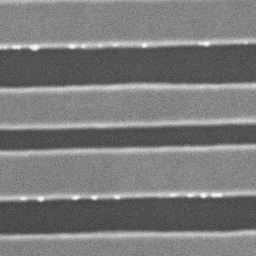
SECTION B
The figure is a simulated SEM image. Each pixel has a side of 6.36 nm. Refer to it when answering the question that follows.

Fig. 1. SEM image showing lines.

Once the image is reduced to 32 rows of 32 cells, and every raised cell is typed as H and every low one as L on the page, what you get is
HHHHHHHHHHHHHHHHHHHHHHHHHHHHHHHH
HHHHHHHHHHHHHHHHHHHHHHHHHHHHHHHH
HHHHHHHHHHHHHHHHHHHHHHHHHHHHHHHH
HHHHHHHHHHHHHHHHHHHHHHHHHHHHHHHH
HHHHHHHHHHHHHHHHHHHHHHHHHHHHHHHH
HHHHHHHHHHHHHHHHHHHHLLLLLHLLLLLL
LLLLLLLLLLLLLLLLLLLLLLLLLLLLLLLL
LLLLLLLLLLLLLLLLLLLLLLLLLLLLLLLL
LLLLLLLLLLLLLLLLLLLLLLLLLLLLLLLL
LLLLLLLLLLLLLLLLLLLLLLLLLLLLLLLL
LLLLLLLLLLLLLLLLLLLLLLLLLLLLLLLL
HHHHHHHHHHHHHHHHHHHHHHHHHHHHHHHH
HHHHHHHHHHHHHHHHHHHHHHHHHHHHHHHH
HHHHHHHHHHHHHHHHHHHHHHHHHHHHHHHH
HHHHHHHHHHHHHHHHHHHHHHHHHHHHHHHH
HHHHHHHHHHHHHHHHHHHHHHHLLLLLLLLL
LLLLLLLLLLLLLLLLLLLLLLLLLLLLLLLL
LLLLLLLLLLLLLLLLLLLLLLLLLLLLLLLL
LLLLLLLLLLLLLLLLLLLLHHHHHHHHHHHH
HHHHHHHHHHHHHHHHHHHHHHHHHHHHHHHH
HHHHHHHHHHHHHHHHHHHHHHHHHHHHHHHH
HHHHHHHHHHHHHHHHHHHHHHHHHHHHHHHH
HHHHHHHHHHHHHHHHHHHHHHHHHHHHHHHH
HHHHHHHHHHHHHHHHHHHHHHHHHHHHHHHH
HHHHHHHHHHHHHHHHLLLLLLLLLHLLLLLL
LLLLLLLLLLLLLLLLLLLLLLLLLLLLLLLL
LLLLLLLLLLLLLLLLLLLLLLLLLLLLLLLL
LLLLLLLLLLLLLLLLLLLLLLLLLLLLLLLL
LLLLLLLLLLLLLLLLLLLLLLLLLLLLLLLL
LLLLLLLHHHHHHHHHHHHHHHHHHHHHHHHH
HHHHHHHHHHHHHHHHHHHHHHHHHHHHHHHH
HHHHHHHHHHHHHHHHHHHHHHHHHHHHHHHH